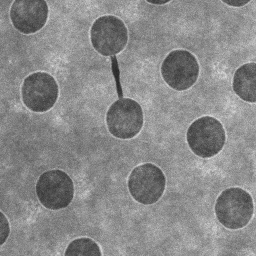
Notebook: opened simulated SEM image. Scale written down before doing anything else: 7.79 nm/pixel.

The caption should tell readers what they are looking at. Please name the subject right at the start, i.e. holes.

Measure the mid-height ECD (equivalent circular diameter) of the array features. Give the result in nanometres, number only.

312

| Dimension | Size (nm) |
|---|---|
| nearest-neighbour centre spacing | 594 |